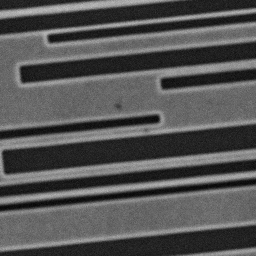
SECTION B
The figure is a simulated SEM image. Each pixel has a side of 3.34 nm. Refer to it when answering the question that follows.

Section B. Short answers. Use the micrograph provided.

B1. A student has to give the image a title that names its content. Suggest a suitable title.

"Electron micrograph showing groups of lines, slits or small figures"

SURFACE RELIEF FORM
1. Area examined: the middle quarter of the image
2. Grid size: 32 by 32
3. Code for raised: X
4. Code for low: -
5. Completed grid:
--------------------------------
------------------------XXXXXXXX
---------------XXXXXXXXXXXXXXXXX
------XXXXXXXXXXXXXXXXXXX-------
XXXXXXXXXXXXXXXXXXXXXXXX--------
XXXXXXXXXXXXXXXXXXXXXXXX--------
XXXXXXXXXXXXXXXXXXXXXXXXX-XXXXXX
XXXXXXXXXXXXXXXXXXXXXXXXXXXXXXXX
XXXXXXXXXXXXXXXXXXXXXXXXXXXXXXXX
XXXXXXXXXXXXXXXXXXXXXXXXXXXXXXXX
XXXXXXXXXXXXXXXXXXXXXXXXXXXXXXXX
XXXXXXXXXXXXXXXXXXXXXXXXXXXXXXXX
XXXXXXXXXXXXXXXXXXXXXX-XXXXXXXXX
XXXXXXXXXXXXXX----------XXXXXXXX
XXX---------------------XXXXXXXX
-------------------XXXXXXXXXXXXX
----------XXXXXXXXXXXXXXXXXXX---
XXXXXXXXXXXXXXXXXXXX------------
XXXXXXXXXXXX--------------------
X-------------------------------
--------------------------------
--------------------------------
--------------------------------
------------------------------XX
------------------XXXXXXXXXXXXXX
---------XXXXXXXXXXXXXXXXXXXX---
-XXXXXXXXXXXXXXXXXXX------------
XXXXXXXXXX----------------------
X-------------------------------
-----------------------XXXXXXXXX
--------------XXXXXXXXXXXX------
-----XXXXXXXXXXXXX--------------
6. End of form